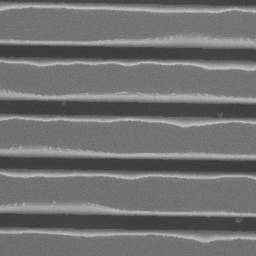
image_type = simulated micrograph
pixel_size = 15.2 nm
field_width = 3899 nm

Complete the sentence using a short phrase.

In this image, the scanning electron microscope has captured lines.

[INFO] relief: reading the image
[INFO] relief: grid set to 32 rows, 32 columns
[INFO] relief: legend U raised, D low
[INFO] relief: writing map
DDDDDDDDDDDDDDDDDDDDDDDDDDDDDDDD
UUUUUUUUUUUUUUUUUUUUUUUUUUUUUUUU
UUUUUUUUUUUUUUUUUUUUUUUUUUUUUUUU
UUUUUUUUUUUUUUUUUUUUUUUUUUUUUUUU
UUUUUUUUUUUUUUUUUUUUUUUUUUUUUUUU
UUUUUUUUUUUUUUUUUUUUUUUUUUUUUUUU
DDDDDDDDDDDDDDDDDDDDDDDDDDDDDDDD
UUDDDDDDDDDDDDDDDDDDDDDDDDDDDDDD
UUUUUUUUUUUUUUUUUUUUUUUUUUUUUUUU
UUUUUUUUUUUUUUUUUUUUUUUUUUUUUUUU
UUUUUUUUUUUUUUUUUUUUUUUUUUUUUUUU
UUUUUUUUUUUUUUUUUUUUUUUUUUUUUUUU
DDDDDDDDDDDDDDDDDUUUUUUUUUUUUUUU
DDDDDDDDDDDDDDDDDDDDDDDDDDDDDDDD
DUUDDDDDDDDDDDDDDDDDDDDDDDDDDDDD
UUUUUUUUUUUUUUUUUUUUUUUUUUUUUUUU
UUUUUUUUUUUUUUUUUUUUUUUUUUUUUUUU
UUUUUUUUUUUUUUUUUUUUUUUUUUUUUUUU
UUUUUUUUUUUUUUUUUUUUUUUUUUUUUUUU
DDDDDDDUUUUUUUUUUUUUUUUUUUUUUUUU
DDDDDDDDDDDDDDDDDDDDDDDDDDDDDDDD
UUDDDDDDDDDDDDDDDDDDDDDDDDDDDDDD
UUUUUUUUUUUUUUUUUUUUUUUUUUUUUUUU
UUUUUUUUUUUUUUUUUUUUUUUUUUUUUUUU
UUUUUUUUUUUUUUUUUUUUUUUUUUUUUUUU
UUUUUUUUUUUUUUUUUUUUUUUUUUUUUUUU
DDDDDDDDDDUUUUUUUUUUUUUUUUUUUUUU
DDDDDDDDDDDDDDDDDDDDDDDDDDDDDDDD
DDDDDDDDDDDDDDDDDDDDDDDDDDDDDDDD
UUUUUUUUUUUUUUUUUUUUUUUUUUUUUUUU
UUUUUUUUUUUUUUUUUUUUUUUUUUUUUUUU
UUUUUUUUUUUUUUUUUUUUUUUUUUUUUUUU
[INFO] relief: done